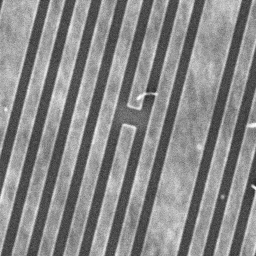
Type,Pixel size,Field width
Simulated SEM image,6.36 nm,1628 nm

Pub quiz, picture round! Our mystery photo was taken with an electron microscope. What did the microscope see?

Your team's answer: groups of lines, slits or small figures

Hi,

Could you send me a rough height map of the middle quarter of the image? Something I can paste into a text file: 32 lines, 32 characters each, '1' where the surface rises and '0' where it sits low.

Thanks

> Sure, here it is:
11000111100011100011110001110001
11000111100011100011110001110001
11000111000111100011100011110001
11000111000111100011100011110001
10001111000111000111100011100011
10001111000111000111100011100011
10001111001111000111000111100011
10001110001111000111100111100011
00011110001110001111000111000111
00011110001110001111000111000111
00011100011110001110001111000111
00011100011110000000001111001111
00111100011100000000001110001111
00111100011100000000011110001111
00111000111100000000011110001111
00111000111100011000011110011111
01111000111000111100011100011111
01111000111000111100011100011111
01110001111000111000111100011111
01110001111000111000111100011111
11110001110001111000111000111111
11110001110001111000111000111111
11100011110001110001111000111111
11100011110001110001111000111111
11100011100011110001110001111111
11100011100011110001110001111111
11000111100011100011110001111111
11000111100011100011100011111111
11000111000111100011100011111111
11000111000111000111100011111111
10001111000111000111100011111111
10001111000111000111000111111111